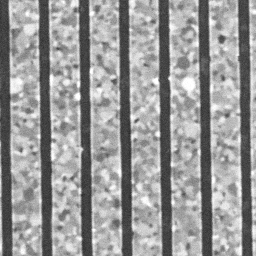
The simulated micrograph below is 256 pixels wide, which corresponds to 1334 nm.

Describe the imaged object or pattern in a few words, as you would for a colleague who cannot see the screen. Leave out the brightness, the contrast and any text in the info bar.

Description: parallel lines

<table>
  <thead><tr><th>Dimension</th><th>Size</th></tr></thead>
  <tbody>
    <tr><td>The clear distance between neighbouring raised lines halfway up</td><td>0.0605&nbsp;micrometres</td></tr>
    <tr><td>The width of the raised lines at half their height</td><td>147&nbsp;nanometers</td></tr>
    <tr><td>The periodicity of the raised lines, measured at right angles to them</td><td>208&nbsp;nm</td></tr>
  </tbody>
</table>